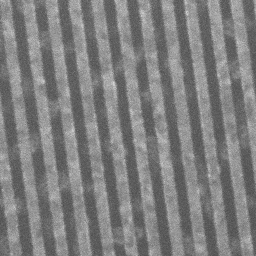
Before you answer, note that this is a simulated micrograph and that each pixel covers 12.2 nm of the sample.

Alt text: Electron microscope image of parallel lines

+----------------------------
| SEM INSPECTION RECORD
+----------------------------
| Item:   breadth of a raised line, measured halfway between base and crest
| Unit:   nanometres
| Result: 127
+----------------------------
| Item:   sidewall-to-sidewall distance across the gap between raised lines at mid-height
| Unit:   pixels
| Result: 13.1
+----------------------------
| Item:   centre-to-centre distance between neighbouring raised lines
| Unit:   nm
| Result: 280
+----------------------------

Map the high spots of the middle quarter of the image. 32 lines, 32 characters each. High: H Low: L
LLLLHHLLLHHHLLLHHHLLLHHLLLLHHLLL
LLLLHHLLLHHHLLLHHHLLLHHHLLLHHLLL
LLLLHHLLLLHHLLLHHHLLLHHHLLLHHHLL
HLLLHHLLLLHHLLLLHHLLLHHHLLLHHHLL
HLLLHHHLLLHHLLLLHHLLLLHHLLLHHHLL
HLLLHHHLLLHHHLLLHHLLLLHHLLLHHHLL
HLLLHHHLLLHHHLLLHHLLLLHHLLLLHHLL
HLLLLHHLLLHHHLLLHHHLLLHHLLLLHHLL
HLLLLHHLLLHHHLLLHHHLLLHHHLLLHHLL
HLLLLHHLLLHHHLLLHHHLLLHHHLLLHHLL
HLLLLHHLLLLHHLLLLHHLLLHHHLLLHHHL
HHLLLHHHLLLHHLLLLHHLLLLHHLLLHHHL
HHLLLHHHLLLHHLLLLHHLLLLHHLLLHHHL
HHLLLHHHLLLHHLLLLHHLLLLHHLLLHHHL
HHLLLHHHLLLHHHLLLHHHLLLHHLLLLHHL
HHLLLLHHLLLHHHLLLHHHLLLHHHLLLHHL
HHLLLLHHLLLLHHLLLHHHLLLHHHLLLHHL
HHLLLLHHLLLLHHLLLHHHLLLHHHLLLHHH
HHHLLLHHLLLLHHLLLLHHLLLLHHLLLHHH
HHHLLLHHHLLLHHLLLLHHLLLLHHLLLHHH
LHHLLLHHHLLLHHHLLLHHLLLLHHLLLHHH
LHHLLLHHHLLLHHHLLLHHLLLLHHLLLHHH
LHHLLLHHHLLLHHHLLLHHHLLLHHLLLLHH
LHHLLLLHHLLLLHHLLLHHHLLLHHHLLLHH
LHHHLLLHHLLLLHHLLLHHHLLLHHHLLLHH
LHHHLLLHHLLLLHHLLLLHHLLLHHHLLLHH
LHHHLLLHHHLLLHHLLLLHHLLLHHHLLLHH
LHHHLLLHHHLLLHHHLLLHHLLLLHHLLLHH
LHHHLLLHHHLLLHHHLLLHHLLLLHHLLLLH
LLHHLLLLHHLLLHHHLLLHHHLLLHHLLLLH
LLHHLLLLHHLLLHHHLLLLHHLLLHHHLLLH
LLHHLLLLHHLLLLHHLLLHHHLLLHHHLLLH